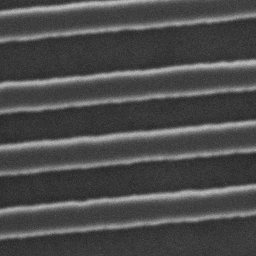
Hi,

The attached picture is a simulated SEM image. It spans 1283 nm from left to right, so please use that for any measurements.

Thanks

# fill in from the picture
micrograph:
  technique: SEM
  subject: lines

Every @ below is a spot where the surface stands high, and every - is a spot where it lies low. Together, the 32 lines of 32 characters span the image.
----------@@@@@@@@@@@@@@@@@@@@@@
@@@@@@@@@@@@@@@@@@@@@@@@@@@@@@@@
@@@@@@@@@@@@@@@@@@@@@@@@@@@@@---
@@@@@@@@@@@@@@@@@@--------------
@@@@@@@-------------------------
--------------------------------
--------------------------------
--------------------------------
---------------------@@@@@@@@@@@
-----------@@@@@@@@@@@@@@@@@@@@@
@@@@@@@@@@@@@@@@@@@@@@@@@@@@@@@@
@@@@@@@@@@@@@@@@@@@@@@@@@@@-----
@@@@@@@@@@@@@@@@@@--------------
@@@@@@@-------------------------
--------------------------------
-----------------------------@@@
-------------------@@@@@@@@@@@@@
--------@@@@@@@@@@@@@@@@@@@@@@@@
@@@@@@@@@@@@@@@@@@@@@@@@@@@@@@@@
@@@@@@@@@@@@@@@@@@@@@@@@@-------
@@@@@@@@@@@@@@@-----------------
@@@@@---------------------------
--------------------------------
------------------------------@@
------------------@@@@@@@@@@@@@@
-------@@@@@@@@@@@@@@@@@@@@@@@@@
@@@@@@@@@@@@@@@@@@@@@@@@@@@@@@@@
@@@@@@@@@@@@@@@@@@@@@@@@@-------
@@@@@@@@@@@@@@@-----------------
@@@@----------------------------
--------------------------------
--------------------------------